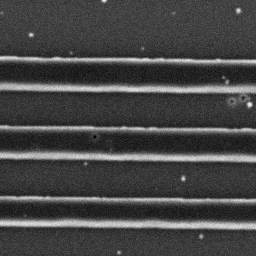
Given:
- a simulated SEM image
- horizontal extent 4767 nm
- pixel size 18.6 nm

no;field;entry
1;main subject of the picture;lines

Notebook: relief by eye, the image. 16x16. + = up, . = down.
................
................
................
................
++++++++++++++++
.+++++++++++++++
................
................
++++++++++++++++
++++++++++++++++
................
................
++++++++++++++++
++++++++++++++++
................
................